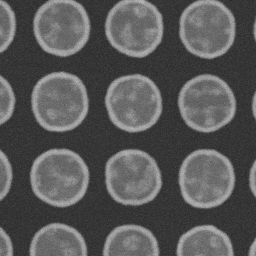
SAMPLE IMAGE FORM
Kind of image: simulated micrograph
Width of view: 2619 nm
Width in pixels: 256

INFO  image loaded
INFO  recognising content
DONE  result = raised bodies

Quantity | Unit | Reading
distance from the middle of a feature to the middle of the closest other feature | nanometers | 750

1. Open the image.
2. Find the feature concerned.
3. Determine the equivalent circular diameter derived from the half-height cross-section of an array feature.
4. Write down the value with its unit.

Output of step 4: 0.55 micrometres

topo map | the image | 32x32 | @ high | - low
@-----@@@@-----@@@------@@@-----
@----@@@@@----@@@@@@---@@@@@----
@@--@@@@@@@---@@@@@@---@@@@@@---
@@--@@@@@@@--@@@@@@@---@@@@@@---
@----@@@@@@---@@@@@@---@@@@@@---
@----@@@@@----@@@@@@---@@@@@@---
-------@@-------@@------@@@@----
--------------------------------
--------------------------------
------@@@-----------------------
@----@@@@@----@@@@@-----@@@@----
@---@@@@@@@---@@@@@@---@@@@@@---
@@--@@@@@@@--@@@@@@@---@@@@@@---
@---@@@@@@@---@@@@@@---@@@@@@---
@----@@@@@----@@@@@@---@@@@@@---
-----@@@@@-----@@@@-----@@@@----
--------------------------------
--------------------------------
--------------------------------
-----@@@@------@@@------@@@@----
@---@@@@@@----@@@@@----@@@@@@---
@---@@@@@@@--@@@@@@@---@@@@@@--@
@---@@@@@@@---@@@@@@---@@@@@@--@
@---@@@@@@@---@@@@@@---@@@@@@---
-----@@@@@----@@@@@----@@@@@----
-------@----------------@@@-----
--------------------------------
--------------------------------
------@@-------@@---------------
@----@@@@@----@@@@@----@@@@@----
@---@@@@@@---@@@@@@----@@@@@@---
@---@@@@@@@--@@@@@@@--@@@@@@@--@